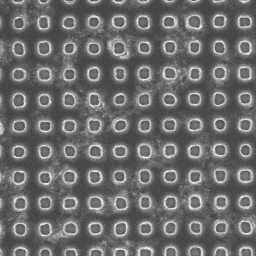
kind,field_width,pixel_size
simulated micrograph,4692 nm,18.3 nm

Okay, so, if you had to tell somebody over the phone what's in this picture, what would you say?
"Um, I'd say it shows a regular array of holes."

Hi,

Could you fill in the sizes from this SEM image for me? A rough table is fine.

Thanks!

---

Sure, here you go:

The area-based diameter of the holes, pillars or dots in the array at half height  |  11.2 pixels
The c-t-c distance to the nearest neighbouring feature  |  454 nanometres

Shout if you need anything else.